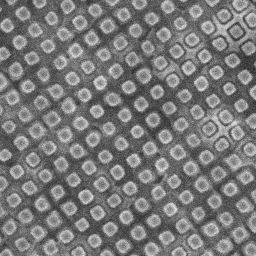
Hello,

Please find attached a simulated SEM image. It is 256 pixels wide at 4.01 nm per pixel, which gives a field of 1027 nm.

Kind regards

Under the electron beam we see a regular array of raised bodies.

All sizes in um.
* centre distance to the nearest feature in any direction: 0.0793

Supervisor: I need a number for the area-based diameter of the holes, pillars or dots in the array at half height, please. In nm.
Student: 49.2